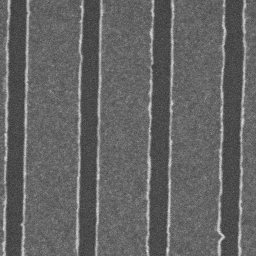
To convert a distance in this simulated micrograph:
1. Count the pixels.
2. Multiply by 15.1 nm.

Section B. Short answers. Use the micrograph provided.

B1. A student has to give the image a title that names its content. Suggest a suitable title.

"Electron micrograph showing one or a few lines or trenches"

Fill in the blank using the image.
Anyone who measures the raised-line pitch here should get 1.09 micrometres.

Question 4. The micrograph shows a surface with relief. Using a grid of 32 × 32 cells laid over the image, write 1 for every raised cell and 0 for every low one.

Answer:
10001111110001111110001111110001
10001111110001111110001111110011
10001111110001111110001111110011
10011111110001111110011111110011
10011111110001111110001111110001
10011111110001111110001111110001
10011111110001111110001111110001
10011111110001111110001111110001
10011111110001111110001111110001
10011111110001111110011111110011
10011111110011111110011111110011
10011111110011111110011111110011
10011111110011111110011111110011
10011111110011111110011111110011
10011111110011111110011111110011
10011111110011111110011111110011
10011111110011111110011111110011
10011111110011111110011111110011
10011111110011111110011111110011
10011111110011111110011111110011
10011111110011111110011111110011
10011111110011111110011111100011
10011111110011111110011111110011
10011111110011111110011111110011
10011111110011111100011111110011
10011111110011111100011111100011
10011111110011111100011111100011
10011111110011111110011111100011
10011111110011111110011111100011
10011111110011111110011111110011
10011111110011111100011111110011
10011111110011111100011111100011